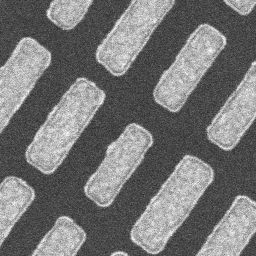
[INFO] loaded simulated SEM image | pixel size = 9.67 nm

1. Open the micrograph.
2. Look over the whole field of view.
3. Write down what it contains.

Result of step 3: holes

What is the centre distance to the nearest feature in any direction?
645 nm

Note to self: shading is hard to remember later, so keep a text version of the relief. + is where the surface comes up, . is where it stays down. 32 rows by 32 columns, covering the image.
+++++++....++++++.....+++++++...
++++++.....+++++.....+++++++++.+
+++++++...+++++.....++++++++++++
++++++++.++++++....++++++.++++++
++++++++++++++.....+++++....++++
++...++++++++.....+++++.....++++
++....++++++.....++++++....+++++
+.....++++++....++++++.....+++++
+.....+++++++...+++++.....+++++.
.....++++++++++++++++....++++++.
....+++++..+++++++++.....+++++..
...+++++.....++++++.....+++++...
...+++++.....+++++++...++++++...
..+++++.....+++++++++.++++++....
.+++++.....++++++++++++++++.....
.+++++.....++++++++++++++++....+
+++++...+.++++++..++++++++....++
++++.....++++++....++++++++...++
++++.....+++++....++++++++++++++
+++.....+++++.....++++++++++++++
++++...++++++....++++++..+++++++
++++++++++++....++++++....++++++
+.++++++++++....+++++.....++++++
....+++++++....+++++......++++++
....+++++++...++++++.....+++++++
...+++++++++.++++++.....+++++...
...+++++++++++++++......+++++...
..+++++..+++++++++.....+++++....
.++++++...+++++++.....+++++.....
.+++++....+++++++....+++++.....+
+++++.....++++++++...+++++.....+
+++++....++++++++++++++++.....++